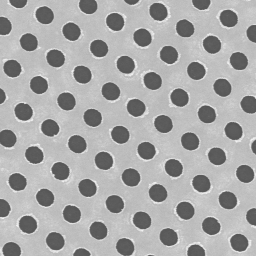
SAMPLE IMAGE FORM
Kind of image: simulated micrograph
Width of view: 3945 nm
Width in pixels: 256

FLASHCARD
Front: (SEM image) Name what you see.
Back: a regular array of holes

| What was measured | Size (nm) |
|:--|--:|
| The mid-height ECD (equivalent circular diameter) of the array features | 281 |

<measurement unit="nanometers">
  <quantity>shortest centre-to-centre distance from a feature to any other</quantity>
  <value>474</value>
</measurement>